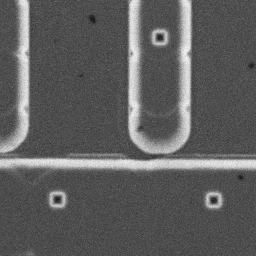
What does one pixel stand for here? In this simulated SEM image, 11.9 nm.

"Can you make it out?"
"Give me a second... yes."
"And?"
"wiring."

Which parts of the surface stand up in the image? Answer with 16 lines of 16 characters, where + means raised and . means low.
+.......++++....
+.......++++....
+.......++++....
+.......++++....
+.......++++....
+.......++++....
+.......++++....
+.......++++....
+........++.....
................
++++++++++++++++
++++++++++++++++
++++++++++++++++
++++++++++++++++
++++++++++++++++
++++++++++++++++